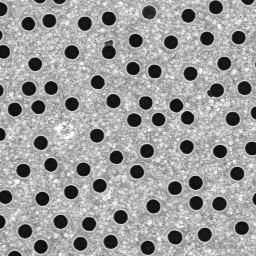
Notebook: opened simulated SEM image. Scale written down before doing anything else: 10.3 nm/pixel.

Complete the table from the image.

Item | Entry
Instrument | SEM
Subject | a regular array of holes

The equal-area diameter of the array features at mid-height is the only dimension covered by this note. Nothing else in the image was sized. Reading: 144 nanometers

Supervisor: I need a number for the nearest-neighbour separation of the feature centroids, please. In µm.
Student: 0.257